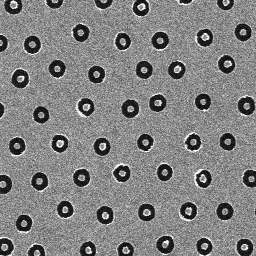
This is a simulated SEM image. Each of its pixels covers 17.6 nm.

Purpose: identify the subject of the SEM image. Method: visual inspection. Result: a regular array of ring-shaped grooves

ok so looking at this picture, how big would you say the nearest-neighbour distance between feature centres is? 617 nm